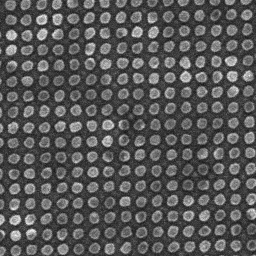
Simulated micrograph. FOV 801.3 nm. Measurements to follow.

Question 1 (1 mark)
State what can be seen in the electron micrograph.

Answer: a regular array of raised bodies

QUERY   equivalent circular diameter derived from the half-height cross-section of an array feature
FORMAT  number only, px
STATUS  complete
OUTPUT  10.2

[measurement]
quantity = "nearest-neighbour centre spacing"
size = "15 px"